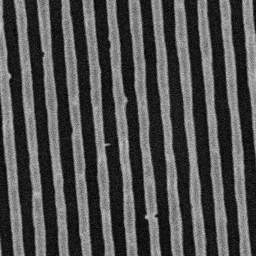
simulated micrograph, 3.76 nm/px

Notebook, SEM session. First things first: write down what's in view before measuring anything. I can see parallel lines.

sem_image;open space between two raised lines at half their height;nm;48.7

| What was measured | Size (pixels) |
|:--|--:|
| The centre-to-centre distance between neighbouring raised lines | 22.7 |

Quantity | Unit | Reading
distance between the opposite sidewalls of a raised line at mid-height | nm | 37.9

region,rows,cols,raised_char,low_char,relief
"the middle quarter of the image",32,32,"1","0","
01100011100011000011000111000111
01100001100011000011000111000110
01100011100011000011000111000111
01100011100011000011000111000110
01100001100011100011000011000111
01100001100011100011000011000111
01110001100011100011000011000011
01110001100011100011000011000011
01110001100011110011000011000011
01110001100001100011100011000011
01110001100001100011100011000011
01110001100001100001100011000011
01110001100001100001100011000011
00110001100001110001100001000011
00110000110001110001100001100011
00110000110000110001100001100011
00110000110001110001100001100011
00110000110001110001100001100001
00111000110000110001100001100001
00111000110000110001100001100001
00111000111000110001100001100001
00111000110000110001110001100001
00011000110000110000110001100001
00011000111000110000110000110001
00011000111000110000110000110000
00011000111000110000110000110000
00011000111000010000110000110000
00011000111000011000110000110000
00011000111000011000110000110000
00011000011000011000110000110000
00011100011000011000111000110000
00011100011000011000111000110000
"